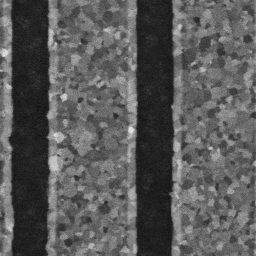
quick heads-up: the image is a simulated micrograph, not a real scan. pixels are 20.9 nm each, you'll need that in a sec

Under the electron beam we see one or a few lines or trenches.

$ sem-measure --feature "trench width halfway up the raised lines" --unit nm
968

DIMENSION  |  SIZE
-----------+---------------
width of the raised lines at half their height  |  1620 nanometers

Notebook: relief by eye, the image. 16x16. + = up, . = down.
...+++++...+++++
...+++++...+++++
...+++++...+++++
...+++++...+++++
...+++++...+++++
...+++++...+++++
...+++++...+++++
...+++++...+++++
...+++++...+++++
...+++++...+++++
...+++++...+++++
...+++++...+++++
...+++++...+++++
+..+++++...+++++
+..+++++...+++++
...+++++...+++++